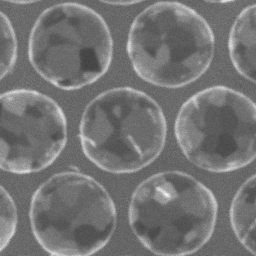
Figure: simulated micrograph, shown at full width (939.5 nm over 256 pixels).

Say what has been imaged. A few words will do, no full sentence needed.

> raised bodies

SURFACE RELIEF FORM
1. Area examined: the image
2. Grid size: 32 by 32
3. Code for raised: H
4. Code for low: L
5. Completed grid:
LLLLLLLLHLLLLLLHLLLHHHHLLLLLLLLL
LLLLLLHHHHHHLLLLLLHHHHHHLLLLLLHH
HLLLLHHHHHHHHLLLLHHHHHHHHHLLLLHH
HLLLHHHHHHHHHLLLHHHHHHHHHHLLLHHH
HHLLHHHHHHHHHHLLHHHHHHHHHHHLLHHH
HHLLHHHHHHHHHHLLHHHHHHHHHHHLLHHH
HHLLHHHHHHHHHHLLHHHHHHHHHHHLLHHH
HHLLHHHHHHHHHHLLHHHHHHHHHHLLLHHH
HLLLHHHHHHHHHLLLLHHHHHHHHHLLLLHH
LLLLLHHHHHHHHLLLLLHHHHHHHLLLLLLH
LLLLLLLHHHHLLLLLLLLHHHHLLLLLLLLL
LHHHLLLLLLLLLHHHHLLLLLLLLLHHHLLL
HHHHHHLLLLLLHHHHHHHLLLLLHHHHHHHL
HHHHHHHLLLLHHHHHHHHHLLLHHHHHHHHH
HHHHHHHHLLHHHHHHHHHHLLHHHHHHHHHH
HHHHHHHHLLHHHHHHHHHHHLHHHHHHHHHH
HHHHHHHHLLHHHHHHHHHHHLHHHHHHHHHH
HHHHHHHHLLHHHHHHHHHHHLHHHHHHHHHH
HHHHHHHHLLHHHHHHHHHHLLLHHHHHHHHH
HHHHHHHLLLLHHHHHHHHHLLLHHHHHHHHH
HHHHHHLLLLLLHHHHHHLLLLLLHHHHHHHL
LLHLLLLLLLLLLLHLLLLLLLLLLLLLLLLL
LLLLLLHHHHHHLLLLLLHHHHHHLLLLLLLH
LLLLLHHHHHHHHLLLLHHHHHHHHHLLLLHH
HLLLHHHHHHHHHHLLLHHHHHHHHHLLLHHH
HHLLHHHHHHHHHHLLHHHHHHHHHHHLLHHH
HHLLHHHHHHHHHHLLHHHHHHHHHHHLLHHH
HHLLHHHHHHHHHHLLHHHHHHHHHHHLLHHH
HHLLHHHHHHHHHHLLLHHHHHHHHHHLLHHH
HLLLLHHHHHHHHHLLLHHHHHHHHHLLLLHH
HLLLLHHHHHHHHLLLLLHHHHHHHLLLLLHH
LLLLLLHHHHHHLLLLLLLHHHHHLLLLLLLH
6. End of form